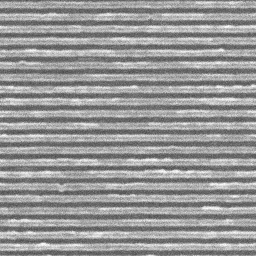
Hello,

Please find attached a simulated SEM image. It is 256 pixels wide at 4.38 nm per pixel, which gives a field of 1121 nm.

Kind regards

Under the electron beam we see parallel lines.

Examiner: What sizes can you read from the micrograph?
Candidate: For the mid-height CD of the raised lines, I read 25.2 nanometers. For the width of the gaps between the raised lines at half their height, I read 28.5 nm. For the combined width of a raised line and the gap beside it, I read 53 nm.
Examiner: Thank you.